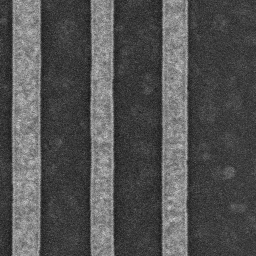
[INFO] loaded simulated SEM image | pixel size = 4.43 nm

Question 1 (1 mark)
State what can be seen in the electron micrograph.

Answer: one or a few lines or trenches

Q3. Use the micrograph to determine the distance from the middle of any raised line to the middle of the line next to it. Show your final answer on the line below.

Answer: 328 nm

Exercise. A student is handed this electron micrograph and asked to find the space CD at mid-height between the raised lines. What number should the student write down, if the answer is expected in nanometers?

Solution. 228